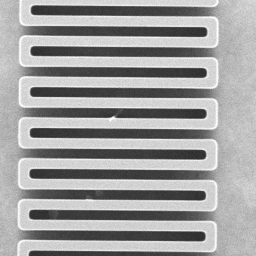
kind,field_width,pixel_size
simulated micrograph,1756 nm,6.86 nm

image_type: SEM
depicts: groups of lines, slits or small figures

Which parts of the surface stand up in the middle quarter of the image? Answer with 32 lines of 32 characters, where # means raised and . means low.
################################
................................
................................
################################
################################
################################
................................
................................
####################............
################################
################################
................................
................................
##..........#...................
################################
################################
................................
................................
................................
################################
################################
................................
................................
................................
################################
################################
..............................##
................................
................................
################################
################################
............####################